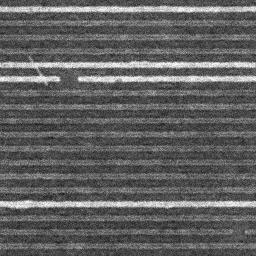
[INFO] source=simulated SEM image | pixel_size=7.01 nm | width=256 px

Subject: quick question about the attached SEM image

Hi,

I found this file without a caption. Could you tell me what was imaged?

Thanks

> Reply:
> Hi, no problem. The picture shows parallel lines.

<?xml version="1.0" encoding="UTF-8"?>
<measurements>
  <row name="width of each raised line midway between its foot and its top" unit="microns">0.0298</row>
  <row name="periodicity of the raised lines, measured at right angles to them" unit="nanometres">97.6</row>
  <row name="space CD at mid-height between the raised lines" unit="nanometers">66.6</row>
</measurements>